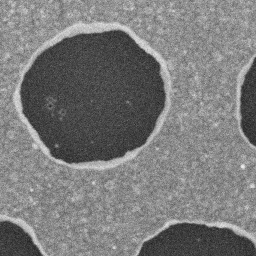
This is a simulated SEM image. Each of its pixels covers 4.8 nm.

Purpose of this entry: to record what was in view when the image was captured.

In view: holes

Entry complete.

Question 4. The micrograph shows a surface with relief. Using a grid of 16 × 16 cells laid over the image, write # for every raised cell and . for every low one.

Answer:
################
################
####....########
##.......#######
##........#####.
#..........####.
#.........#####.
##........#####.
##........#####.
###.....########
################
################
################
################
..########.....#
..#######.......